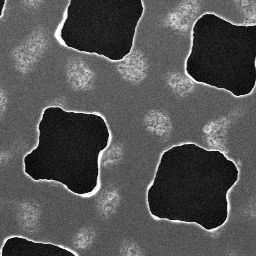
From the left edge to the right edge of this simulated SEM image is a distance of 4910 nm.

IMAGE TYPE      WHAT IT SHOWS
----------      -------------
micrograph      holes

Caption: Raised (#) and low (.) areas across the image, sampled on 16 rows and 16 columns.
####.....#######
####.....###...#
####....####....
######..####....
############....
##############..
################
###...##########
##.....#########
##....####....##
##....####.....#
####..###......#
#########.....##
##########....##
################
....############